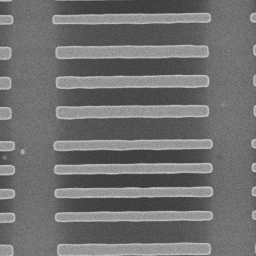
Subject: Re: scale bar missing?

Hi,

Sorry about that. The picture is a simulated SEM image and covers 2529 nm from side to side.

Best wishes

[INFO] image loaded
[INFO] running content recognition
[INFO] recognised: groups of lines, slits or small figures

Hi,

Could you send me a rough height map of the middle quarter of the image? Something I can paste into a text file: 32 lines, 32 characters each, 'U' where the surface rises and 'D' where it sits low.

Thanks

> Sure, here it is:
DDDDDDDDDDDDDDDDDDDDDDDDDDDDDDDD
DDDDDDDDDDDDDDDDDDDDDDDDDDDDDDDD
DDDDDDDDDDDDDDDDDDDDDDDDDDDDDDDD
UUUUUUUUUUUUUUUUUUUUUUUUUUUUUUUU
UUUUUUUUUUUUUUUUUUUUUUUUUUUUUUUU
UUUUUUUUUUUUUUUUUUUUUUUUUUUUUUUU
DDDDDDDDDDDDDDDDDDDDDDDDDDDDDDDD
DDDDDDDDDDDDDDDDDDDDDDDDDDDDDDDD
DDDDDDDDDDDDDDDDDDDDDDDDDDDDDDDD
DDDDDDDDDDDDDDDDDDDDDDDDDDDDDDDD
DDDDDDDDDDDDDDDDDDDDDDDDDDUUUUUU
UUUUUUUUUUUUUUUUUUUUUUUUUUUUUUUU
UUUUUUUUUUUUUUUUUUUUUUUUUUUUUUUU
UUUUUUDDDUDDDDDDDDDDDDDDDDDDDDDD
DDDDDDDDDDDDDDDDDDDDDDDDDDDDDDDD
DDDDDDDDDDDDDDDDDDDDDDDDDDDDDDDD
DDDDDDDDDDDDDDDDDDDDDDDDDDDDDDDD
DDDDDDDDDDDDDDDDDDDDDDDDDDDDDDDD
DDDDDDDDDDDDDDDDDDDDDDDDDDDDDDDD
UUUUUUUUUUUUUUUUUUUUUUUUUUUUUUUU
UUUUUUUUUUUUUUUUUUUUUUUUUUUUUUUU
UDDDDDDDDDDDDDDDDDDDDDDDDDDDDDDD
DDDDDDDDDDDDDDDDDDDDDDDDDDDDDDDD
DDDDDDDDDDDDDDDDDDDDDDDDDDDDDDDD
DDDDDDDDDDDDDDDDDDDDDDDDDDDDDDDD
UUUUUUUUUUUUUUUUUUUUUUUUUUUUUUUU
UUUUUUUUUUUUUUUUUUUUUUUUUUUUUUUU
DDDDDDDDDDDDDDDDDDDDDDDDDDDDDDDD
DDDDDDDDDDDDDDDDDDDDDDDDDDDDDDDD
DDDDDDDDDDDDDDDDDDDDDDDDDDDDDDDD
DDDDDDDDDDDDDDDDDDDDDDDDDDDDDDDD
UUUUUUUUUUUUUUUUUUUUUUUUUUUUUUUU